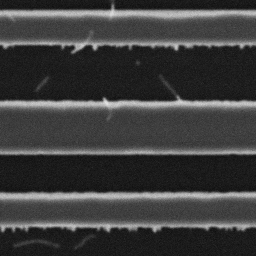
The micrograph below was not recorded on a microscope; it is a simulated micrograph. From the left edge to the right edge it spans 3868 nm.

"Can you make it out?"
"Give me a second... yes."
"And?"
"lines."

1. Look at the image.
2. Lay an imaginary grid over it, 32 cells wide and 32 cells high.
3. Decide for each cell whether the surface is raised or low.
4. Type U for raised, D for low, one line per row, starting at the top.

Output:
DDDDDDDDDDDDDDDDDDDDDDDDDDDDDDDD
UUDDDDDUUDUUUDUUUUDDDDDDDDUUUUUU
UUUUUUUUUUUUUUUUUUUUUUUUUUUUUUUU
UUUUUUUUUUUUUUUUUUUUUUUUUUUUUUUU
UUUUUUUUUUUUUUUUUUUUUUUUUUUUUUUU
UUUUUUUUUUUUUUUUUUUUUUUUUUUUUUUU
DDDDDDDDDDDDDDDDDDDDDDDDDDDDDDDD
DDDDDDDDDDDDDDDDDDDDDDDDDDDDDDDD
DDDDDDDDDDDDDDDDDDDDDDDDDDDDDDDD
DDDDDDDDDDDDDDDDDDDDDDDDDDDDDDDD
DDDDDDDDDDDDDDDDDDDDDDDDDDDDDDDD
DDDDDDDDDDDDDDDDDDDDDDDDDDDDDDDD
DDDDDDDDDDDDDDDDDDDDDDDDDDDDDDDD
UUUUUUUUUUUUUUUUUUUUUUUUUUUUUUUU
UUUUUUUUUUUUUUUUUUUUUUUUUUUUUUUU
UUUUUUUUUUUUUUUUUUUUUUUUUUUUUUUU
UUUUUUUUUUUUUUUUUUUUUUUUUUUUUUUU
UUUUUUUUUUUUUUUUUUUUUUUUUUUUUUUU
UUUUUUUUUUUUUUUUUUUUUUUUUUUUUUUU
DDDDDDDDDDDDDDDDDDDDDDDDDDDDDDDD
DDDDDDDDDDDDDDDDDDDDDDDDDDDDDDDD
DDDDDDDDDDDDDDDDDDDDDDDDDDDDDDDD
DDDDDDDDDDDDDDDDDDDDDDDDDDDDDDDD
DDDDDDDDDDDDDDDDDDDDDDDDDDDDDDDD
UUUUUUUUUUUUUUUUUUUUUUUUUUUUUUUU
UUUUUUUUUUUUUUUUUUUUUUUUUUUUUUUU
UUUUUUUUUUUUUUUUUUUUUUUUUUUUUUUU
UUUUUUUUUUUUUUUUUUUUUUUUUUUUUUUU
DDDDDDDDDDDDDDDDDDDDDDDDDDDDDDDD
DDDDDDDDDDDDDDDDDDDDDDDDDDDDDDDD
DDDDDDDDDDDDDDDDDDDDDDDDDDDDDDDD
DDDDDDDDDDDDDDDDDDDDDDDDDDDDDDDD